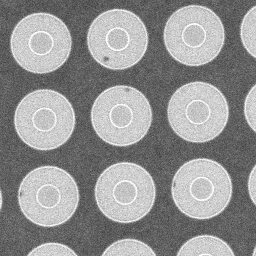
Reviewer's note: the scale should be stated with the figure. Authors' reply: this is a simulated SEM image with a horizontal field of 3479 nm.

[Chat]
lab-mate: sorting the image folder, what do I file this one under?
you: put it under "an array of small figures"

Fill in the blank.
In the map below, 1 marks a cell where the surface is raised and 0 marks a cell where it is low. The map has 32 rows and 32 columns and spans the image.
11111111111111111111111111111111
11111111111111001111110000111110
11100001111100000111100000011110
11000000111000000011100110001100
11001100011001110011100111001100
10001110011001110011100110001110
11001100011000000011100000011110
11000000111100000111110000111111
11100001111111011111111111111111
11111111111111111111111111111111
11111111111111111111111100111111
11110001111110000111110000011110
11100000111100000011100000001110
11000000011100110001100111001110
11001110011100111001100111001110
11001110011100110001100000001110
11000000011100000011110000011111
11100000111110000111111100111111
11111001111111111111111111111111
11111111111111111111111111111111
11111111111111101111111000011111
11110000111110000011110000001111
11100000011100000001110011000110
11100110001100111001110011100110
11000110001100111001110011000110
11100110001100010001110000001111
11100000011110000011111000011111
11110000111111000111111111111111
11111111111111111111111111111111
11111111111111111111111111111111
11111101111111000011111000001111
11110000011110000001111000000111